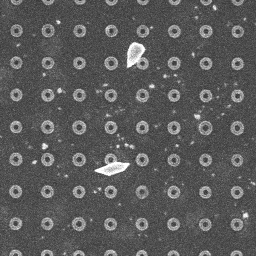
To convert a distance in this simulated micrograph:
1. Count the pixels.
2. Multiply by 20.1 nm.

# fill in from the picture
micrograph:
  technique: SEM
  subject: a regular array of ring-shaped raised bodies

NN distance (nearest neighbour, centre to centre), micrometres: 0.631